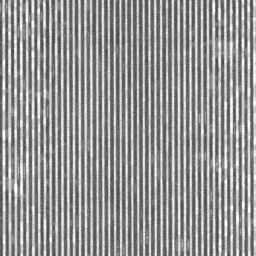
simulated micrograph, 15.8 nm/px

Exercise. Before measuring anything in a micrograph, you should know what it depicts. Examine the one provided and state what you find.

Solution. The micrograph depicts parallel lines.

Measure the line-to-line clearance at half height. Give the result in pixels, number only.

4.25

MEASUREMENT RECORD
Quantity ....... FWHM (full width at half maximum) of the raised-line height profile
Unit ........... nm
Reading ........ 33.5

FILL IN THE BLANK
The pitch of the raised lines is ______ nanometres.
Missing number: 91.8